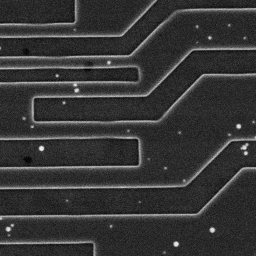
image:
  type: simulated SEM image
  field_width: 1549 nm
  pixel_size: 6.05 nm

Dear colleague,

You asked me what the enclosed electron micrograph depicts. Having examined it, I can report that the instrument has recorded groups of lines, slits or small figures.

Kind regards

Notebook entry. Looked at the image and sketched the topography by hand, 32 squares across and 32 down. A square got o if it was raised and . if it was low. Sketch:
.........oooooooooo.............
.........ooooooooo....oooooooooo
.........oooooooo....ooooooooooo
oooooooooooooooo....oooooooooooo
ooooooooooooo......ooooooooooooo
..................oooooooooooooo
.................ooooooo........
ooooooooooooooooooooooo.........
oooo.............ooooo..........
.................oooo....ooooooo
oooooooooooooooooooo....oooooooo
ooooooooooooooooooo....ooooooooo
oooo..................oooooooooo
oooo.................ooooooooooo
oooo................oooooooooooo
oooooooooooooooooooooooooooooooo
oooooooooooooooooooooooooooooooo
.................oooooooooooooo.
.................ooooooooooo....
.................oooooooooo.....
.................ooooooooo......
ooooooooooooooooooooooooo.....oo
oooooooooooooooooooooooo.....ooo
oooo........................oooo
...........................ooooo
..........................oooooo
.........................ooooooo
oooooooooooooooooooooooooooooooo
oooooooooooooooooooooooooooooooo
oooooooooooooooooooooooooooooooo
...........ooooooooooooooooooooo
............oooooooooooooooooooo